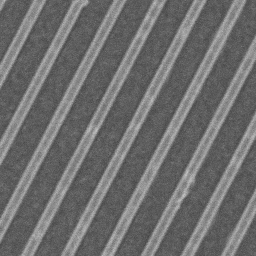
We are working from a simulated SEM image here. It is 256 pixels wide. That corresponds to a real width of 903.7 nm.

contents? parallel lines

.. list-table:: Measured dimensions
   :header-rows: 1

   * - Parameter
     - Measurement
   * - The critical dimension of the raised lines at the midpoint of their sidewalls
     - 35.2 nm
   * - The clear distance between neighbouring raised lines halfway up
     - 90.1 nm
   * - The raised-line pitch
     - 0.126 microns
